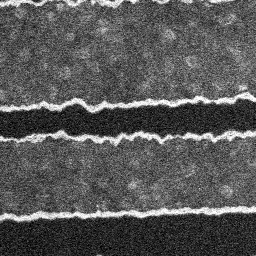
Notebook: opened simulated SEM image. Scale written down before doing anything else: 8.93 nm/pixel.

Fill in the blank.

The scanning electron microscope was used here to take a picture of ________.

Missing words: one or a few lines or trenches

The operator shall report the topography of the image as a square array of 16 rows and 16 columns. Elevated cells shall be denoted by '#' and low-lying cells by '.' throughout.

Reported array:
................
................
................
................
................
................
....#...########
################
###.####.#####..
................
................
................
................
..##############
################
################